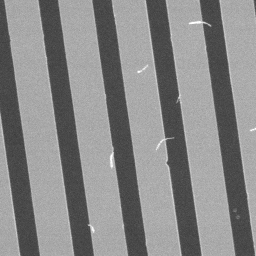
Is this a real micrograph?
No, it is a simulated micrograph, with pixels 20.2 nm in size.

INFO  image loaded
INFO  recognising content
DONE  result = parallel lines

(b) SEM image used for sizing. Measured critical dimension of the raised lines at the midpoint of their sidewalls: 0.669 microns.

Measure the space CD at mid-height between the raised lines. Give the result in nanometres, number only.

407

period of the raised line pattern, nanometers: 1080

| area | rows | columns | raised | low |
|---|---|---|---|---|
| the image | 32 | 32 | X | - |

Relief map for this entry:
-XXXX--XXXXX--XXXX---XXXX---XXXX
-XXXX---XXXX--XXXX---XXXX---XXXX
-XXXX---XXXX--XXXXX--XXXX---XXXX
-XXXX---XXXX---XXXX--XXXX---XXXX
-XXXX---XXXX---XXXX--XXXXX--XXXX
-XXXXX--XXXX---XXXX---XXXX--XXXX
-XXXXX--XXXX---XXXX---XXXX--XXXX
--XXXX--XXXXX--XXXX---XXXX---XXX
--XXXX--XXXXX--XXXX---XXXX---XXX
--XXXX---XXXX--XXXX---XXXX---XXX
--XXXX---XXXX---XXXX--XXXX---XXX
--XXXX---XXXX---XXXX--XXXXX--XXX
--XXXX---XXXX---XXXX--XXXXX--XXX
--XXXXX--XXXX---XXXX---XXXX--XXX
---XXXX--XXXXX--XXXX---XXXX--XXX
---XXXX--XXXXX--XXXX---XXXX---XX
---XXXX---XXXX--XXXX---XXXX---XX
---XXXX---XXXX--XXXXX--XXXX---XX
X--XXXX---XXXX---XXXX--XXXXX--XX
X--XXXX---XXXX---XXXX---XXXX--XX
X--XXXXX--XXXX---XXXX---XXXX--XX
X---XXXX--XXXX---XXXX---XXXX--XX
X---XXXX--XXXXX--XXXX---XXXX---X
X---XXXX---XXXX--XXXX---XXXX---X
X---XXXX---XXXX--XXXXX--XXXX---X
XX--XXXX---XXXX---XXXX--XXXX---X
XX--XXXX---XXXX---XXXX--XXXXX--X
XX--XXXXX--XXXX---XXXX---XXXX--X
XX---XXXX--XXXX---XXXX---XXXX--X
XX---XXXX--XXXXX--XXXX---XXXX---
XX---XXXX---XXXX--XXXX---XXXX---
XX---XXXX---XXXX--XXXXX--XXXX---